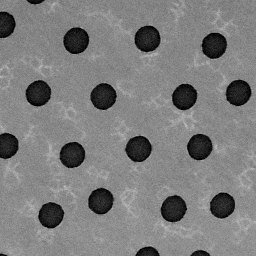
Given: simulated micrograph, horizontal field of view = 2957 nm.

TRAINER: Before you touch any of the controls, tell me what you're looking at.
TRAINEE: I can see a regular array of holes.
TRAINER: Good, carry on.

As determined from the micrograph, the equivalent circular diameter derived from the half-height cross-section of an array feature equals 304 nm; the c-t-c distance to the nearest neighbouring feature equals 0.61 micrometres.